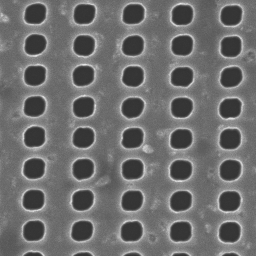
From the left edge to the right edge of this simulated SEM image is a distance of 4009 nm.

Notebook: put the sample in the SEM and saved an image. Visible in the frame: a regular array of holes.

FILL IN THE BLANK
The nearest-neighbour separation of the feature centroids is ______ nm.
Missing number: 481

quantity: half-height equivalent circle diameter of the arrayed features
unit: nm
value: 325